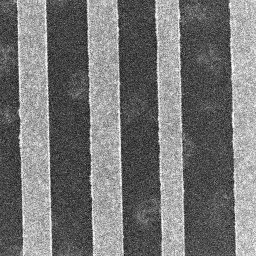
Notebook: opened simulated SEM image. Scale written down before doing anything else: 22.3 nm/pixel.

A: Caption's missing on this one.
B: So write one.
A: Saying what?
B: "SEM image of one or a few lines or trenches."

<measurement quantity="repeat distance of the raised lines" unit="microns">1.52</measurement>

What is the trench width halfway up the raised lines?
930 nanometres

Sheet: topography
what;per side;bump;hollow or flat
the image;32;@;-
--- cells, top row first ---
--@@@@-----@@@@----@@@-------@@@
--@@@@-----@@@@----@@@-------@@@
--@@@@-----@@@@----@@@-------@@@
--@@@@-----@@@@-----@@-------@@@
--@@@@-----@@@@-----@@-------@@@
--@@@@-----@@@@-----@@-------@@@
--@@@@-----@@@@-----@@-------@@@
--@@@@-----@@@@-----@@@------@@@
--@@@@-----@@@@-----@@@------@@@
--@@@@-----@@@@-----@@@------@@@
---@@@-----@@@@-----@@@------@@@
--@@@@-----@@@@-----@@@------@@@
---@@@-----@@@@-----@@@------@@@
--@@@@-----@@@@-----@@@------@@@
--@@@@-----@@@@-----@@@------@@@
---@@@-----@@@@-----@@@------@@@
---@@@-----@@@@-----@@@------@@@
--@@@@-----@@@@-----@@@------@@@
---@@@-----@@@@-----@@@------@@@
---@@@-----@@@@-----@@@------@@@
---@@@-----@@@@-----@@@------@@@
---@@@-----@@@@-----@@@------@@@
---@@@-----@@@@-----@@@------@@@
---@@@-----@@@@-----@@@------@@@
---@@@-----@@@@-----@@@------@@@
---@@@------@@@-----@@@------@@@
---@@@------@@@-----@@@------@@@
---@@@------@@@-----@@@------@@@
---@@@------@@@-----@@@------@@@
---@@@------@@@-----@@@-------@@
---@@@------@@@-----@@@-------@@
---@@@------@@@-----@@@-------@@